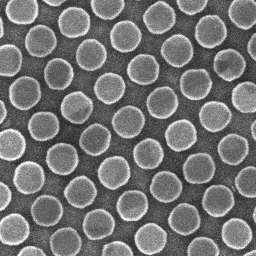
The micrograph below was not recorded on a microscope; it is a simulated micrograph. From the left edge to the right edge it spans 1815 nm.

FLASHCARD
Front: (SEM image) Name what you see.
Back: a regular array of raised bodies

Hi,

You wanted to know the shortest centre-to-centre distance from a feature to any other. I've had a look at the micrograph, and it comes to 0.266 micrometres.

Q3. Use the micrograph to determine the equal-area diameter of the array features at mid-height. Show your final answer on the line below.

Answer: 0.216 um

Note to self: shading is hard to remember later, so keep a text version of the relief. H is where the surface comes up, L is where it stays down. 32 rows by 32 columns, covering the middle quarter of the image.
HHLLHHHHHLLLLLLLHHHHHHHHLLLLHHLL
HHLLLLLLLLLLLLLLHHHHHHHLLLLLLLLL
HHLLLLLLLLLHLLLLHHHHHHHLLLLLLLHH
HHLLLLLLLHHHHHLLLHHHHHHLLLLLLHHH
HHLLLLLLHHHHHHHLLLHHHHLLLLLLLHHH
HLLLLLLLHHHHHHHLLLLLLLLLLLLLLHHH
LLLLLLLLHHHHHHHLLLLLLLLHHHHLLHHH
LLHHHLLLHHHHHHHLLLLLLLHHHHHHLLHH
HHHHHHLLLHHHHHLLLLLLLHHHHHHHLLLH
HHHHHHHLLLHHLLLLLLLLLHHHHHHHLLLL
HHHHHHHLLLLLLLLLLLLLLHHHHHHHLLLL
HHHHHHHLLLLLLLHHHHHLLHHHHHHHLLLL
HHHHHHHLLLLLLHHHHHHHLLHHHHHLLLLL
HHHHHHLLLLLLHHHHHHHHLLLLHLLLLLLL
LLHHHLLLLLLLHHHHHHHHLLLLLLLLHHHL
LLLLLLLHHLLLHHHHHHHHLLLLLLLHHHHH
LLLLLHHHHHHLLHHHHHHLLLLLLLHHHHHH
LLLLHHHHHHHLLLHHHHLLLLLLLHHHHHHH
LLLLHHHHHHHLLLLLLLLLLLLLLHHHHHHH
LLLLHHHHHHHLLLLLLLLHHHHLLLHHHHHH
HHLLHHHHHHHLLLLLLLHHHHHHLLHHHHHH
HHHLLHHHHHLLLLLLLLHHHHHHHLLLHLLL
HHHLLLHHHLLLLLLLLHHHHHHHHLLLLLLL
HHHLLLLLLLLHHHHLLLHHHHHHHLLLLLLH
HHHLLLLLLLHHHHHHLLHHHHHHLLLLLLHH
HHHLLLLLLHHHHHHHLLLHHHHLLLLLLLHH
HHLLLLLLLHHHHHHHLLLLLLLLLLLLLLHH
HLLLLLLLLHHHHHHHLLLLLLLHHHHLLLHH
LLLHHHLLLHHHHHHHLLLLLLLHHHHHLLHH
LLHHHHHLLHHHHHHLLLLLLLHHHHHHHLLH
LHHHHHHHLLHHHHLLLLLLLLHHHHHHHLLL
HHHHHHHHLLLLLLLLLLLLLLHHHHHHHLLL